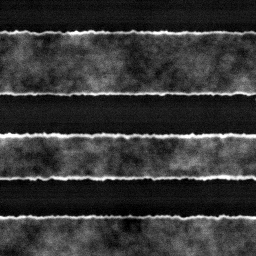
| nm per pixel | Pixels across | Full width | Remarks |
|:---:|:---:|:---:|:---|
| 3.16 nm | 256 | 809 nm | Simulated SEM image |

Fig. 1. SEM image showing lines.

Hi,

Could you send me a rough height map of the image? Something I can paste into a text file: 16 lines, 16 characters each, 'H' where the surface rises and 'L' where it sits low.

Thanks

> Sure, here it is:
LLLLLLLLLLLLLLLL
LLLLLLLLLLLLLLLL
HHHHHHHHHHHHHHHH
HHHHHHHHHHHHHHHH
HHHHHHHHHHHHHHHH
HHHHHHHHHHHHHHHH
LLLLLLLLLLLLLLLL
LLLLLLLLLLLLLLLL
HHHHHHHHHHHHHHHH
HHHHHHHHHHHHHHHH
HHHHHHHHHHHHHHHH
LLLLLLLLLLLLLLLL
LLLLLLLLLLLLLLLL
LLLHLHLLLHHLHLLL
HHHHHHHHHHHHHHHH
HHHHHHHHHHHHHHHH